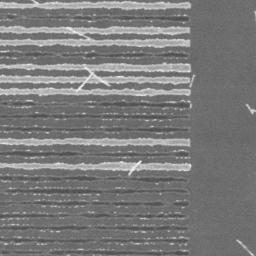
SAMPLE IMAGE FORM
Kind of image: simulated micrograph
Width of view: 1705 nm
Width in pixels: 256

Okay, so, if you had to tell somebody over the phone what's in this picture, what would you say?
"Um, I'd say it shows parallel lines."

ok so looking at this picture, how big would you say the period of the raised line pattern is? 82.4 nanometers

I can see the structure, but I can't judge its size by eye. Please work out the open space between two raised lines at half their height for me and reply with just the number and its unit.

0.0525 micrometres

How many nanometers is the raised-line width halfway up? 31.7